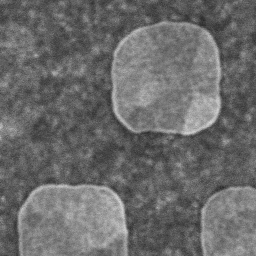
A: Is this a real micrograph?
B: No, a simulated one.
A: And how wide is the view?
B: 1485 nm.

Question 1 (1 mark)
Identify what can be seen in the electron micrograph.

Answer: raised bodies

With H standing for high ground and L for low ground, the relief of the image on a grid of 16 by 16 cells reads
LLLLLLLLLLLLLLLL
LLLLLLLLLLHLLLLL
LLLLLLLLHHHHHLLL
LLLLLLLHHHHHHHLL
LLLLLLLHHHHHHHLL
LLLLLLLHHHHHHHLL
LLLLLLLHHHHHHHLL
LLLLLLLLHHHHHLLL
LLLLLLLLLLLLLLLL
LLLLLLLLLLLLLLLL
LLLLLLLLLLLLLLLL
LLLLLLLLLLLLLLLL
LLHHHHHLLLLLLHHH
LHHHHHHHLLLLLHHH
LHHHHHHHLLLLLHHH
LHHHHHHHLLLLLHHH